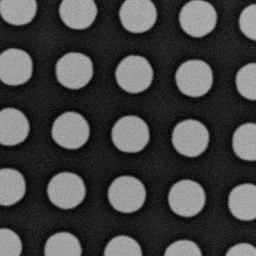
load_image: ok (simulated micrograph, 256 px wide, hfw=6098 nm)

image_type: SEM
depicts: an array of small figures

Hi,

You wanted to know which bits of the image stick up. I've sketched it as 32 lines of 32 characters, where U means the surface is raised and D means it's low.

UUUUUDDDUUUUDDDUUUUDDDDUUUDDDDDD
UUUUDDDUUUUUDDDUUUUDDDDUUUUDDDUU
DUUUDDDDUUUUDDDUUUUDDDUUUUUDDDUU
DDDDDDDDDUUDDDDDUUUDDDDUUUUDDDUU
DDDDDDDDDDDDDDDDDDDDDDDDUDDDDDDU
DDDDDDDDDDDDDDDDDDDDDDDDDDDDDDDD
DUUDDDDDDDDDDDDDDDDDDDDDDDDDDDDD
UUUUDDDUUUUDDDDUUUDDDDDDDDDDDDDD
UUUUDDDUUUUUDDDUUUUDDDUUUUDDDDUU
UUUUDDDUUUUDDDDUUUUDDDUUUUUDDDUU
DUUDDDDDUUUDDDDUUUUDDDUUUUDDDDUU
DDDDDDDDDDDDDDDDUDDDDDDUUUDDDDUU
DDDDDDDDDDDDDDDDDDDDDDDDDDDDDDDD
DDDDDDDDDDDDDDDDDDDDDDDDDDDDDDDD
UUUDDDDDUUDDDDDDDDDDDDDDDDDDDDDD
UUUUDDDUUUUDDDUUUUDDDDUUUDDDDDDU
UUUUDDDUUUUDDDUUUUUDDDUUUUDDDUUU
UUUDDDDUUUUDDDUUUUUDDDUUUUDDDUUU
DDDDDDDDUUDDDDDUUUDDDDUUUUDDDUUU
DDDDDDDDDDDDDDDDDDDDDDDUDDDDDDUU
DDDDDDDDDDDDDDDDDDDDDDDDDDDDDDDD
UUDDDDDDDDDDDDDDDDDDDDDDDDDDDDDD
UUUDDDUUUUDDDDUUUDDDDDDUDDDDDDDD
UUUDDDUUUUUDDDUUUUDDDUUUUDDDDUUU
UUUDDDUUUUUDDDUUUUDDDUUUUUDDDUUU
UUDDDDDUUUDDDDUUUUDDDUUUUUDDDUUU
DDDDDDDDDDDDDDDUDDDDDDUUUDDDDUUU
DDDDDDDDDDDDDDDDDDDDDDDDDDDDDDDD
DDDDDDDDDDDDDDDDDDDDDDDDDDDDDDDD
UUDDDDDUUDDDDDDDDDDDDDDDDDDDDDDD
UUUDDDUUUUDDDDUUUDDDDDUUDDDDDDUD
UUUDDDUUUUDDDUUUUUDDDUUUUDDDUUUU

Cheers